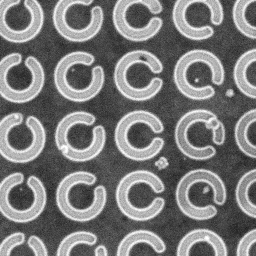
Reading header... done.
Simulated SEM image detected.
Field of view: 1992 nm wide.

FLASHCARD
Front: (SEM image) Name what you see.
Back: an array of small figures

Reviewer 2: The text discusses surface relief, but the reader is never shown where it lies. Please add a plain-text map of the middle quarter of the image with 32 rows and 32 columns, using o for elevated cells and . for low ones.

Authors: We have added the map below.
.oooooooooooo...ooooo...oooo...o
ooooooo..oooo..ooooooo..oooo..oo
ooooooo...ooo..ooooooooooooo..oo
ooooooo...ooo..ooooooooooooo..oo
ooooooo..oooo..ooooooo..oooo...o
.oooooo..ooooo..ooooo...ooooo..o
..ooo....ooooo....oo...oooooo...
........ooooooo.......oooooooo..
o.....ooooooooooo....ooooooooooo
oooooooooooooooooooooooooooooooo
oooooooooooooooooooooooooooooooo
oooooooooooooooooooooooooooooooo
ooo...ooooooooooo....oooooooooo.
o......oooooooo........ooooooo..
...oo..ooooooo...ooo....ooooo...
.ooooooooooooo..oooooo..ooooo..o
.ooooooo..ooo...ooooooo.oooo..oo
oooooooo..ooo..ooooooooooooo..oo
oooooooo..ooo...oooooooooooo..oo
.oooooo...ooo...oooooo..oooo...o
.oooooo..ooooo..oooooo..ooooo...
o.oooo...ooooo....o.....oooooo..
........ooooooo........oooooooo.
oo....ooooooooooo....ooooooooooo
oooooooooooooooooooooooooooooooo
oooooooooooooooooooooooooooooooo
oooooooooooooooooooooooooooooooo
ooo...ooooooooooo.....ooooooooo.
o......ooooooooo.......ooooooo..
.......oooooooo...ooo...ooooo...
..oooooooooooo..oooooo...oooo..o
.ooooooo..oooo..ooooooo.oooo...o